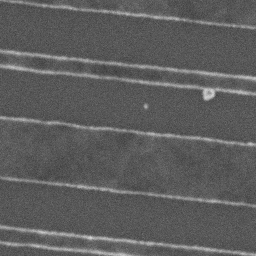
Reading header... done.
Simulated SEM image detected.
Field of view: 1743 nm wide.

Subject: lines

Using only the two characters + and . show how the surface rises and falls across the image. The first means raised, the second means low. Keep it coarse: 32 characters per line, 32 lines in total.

...+++++++++++++++++++++++++++++
.............+++++++++++++++++++
.......................+++++++++
...............................+
................................
................................
++..............................
++++++++++......................
..++++++++++++++++++............
...........++++++++++++++++++...
....................++++++++++++
..........................+..+++
................................
................................
................................
++++++++........................
++++++++++++++++++..............
+++++++++++++++++++++++++++.....
++++++++++++++++++++++++++++++++
++++++++++++++++++++++++++++++++
++++++++++++++++++++++++++++++++
++++++++++++++++++++++++++++++++
..++++++++++++++++++++++++++++++
..........++++++++++++++++++++++
....................++++++++++++
.............................+++
................................
................................
+...............................
++++++++++......................
.+++++++++++++++++++............
...........++++++++++++++++++...